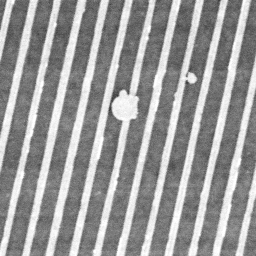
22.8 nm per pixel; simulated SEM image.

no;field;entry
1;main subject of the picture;parallel lines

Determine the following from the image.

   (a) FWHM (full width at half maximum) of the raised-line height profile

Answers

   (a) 131 nanometres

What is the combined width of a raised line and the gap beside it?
528 nm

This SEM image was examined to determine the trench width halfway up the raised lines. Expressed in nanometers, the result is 401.